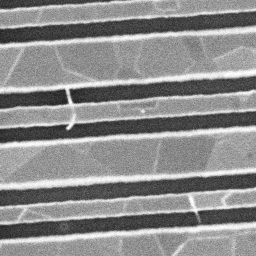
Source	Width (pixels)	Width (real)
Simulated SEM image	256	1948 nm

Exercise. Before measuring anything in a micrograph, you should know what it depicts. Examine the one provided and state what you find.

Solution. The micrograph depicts lines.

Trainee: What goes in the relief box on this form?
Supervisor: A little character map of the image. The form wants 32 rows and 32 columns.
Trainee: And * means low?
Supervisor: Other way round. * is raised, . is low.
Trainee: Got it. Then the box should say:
...........*********************
*****************************...
**************..................
*..............................*
.................***************
...*****************************
********************************
********************************
********************************
******************************..
***************.................
*..............................*
.................***************
..******************************
**********************..........
*********.......................
.......................*********
.........***********************
********************************
********************************
********************************
*******************************.
*****************...............
***.............................
....................************
......**************************
**********************..........
********........................
........................********
.........***********************
********************************
********************************